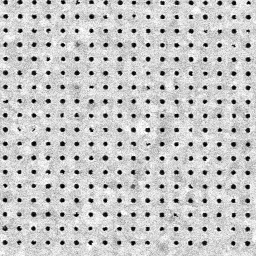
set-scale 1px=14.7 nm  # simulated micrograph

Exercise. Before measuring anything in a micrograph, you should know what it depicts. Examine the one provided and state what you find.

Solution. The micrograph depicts a regular array of holes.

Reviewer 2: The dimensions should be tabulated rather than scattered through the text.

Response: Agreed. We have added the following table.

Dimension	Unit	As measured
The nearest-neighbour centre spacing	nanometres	204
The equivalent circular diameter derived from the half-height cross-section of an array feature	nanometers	74.3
